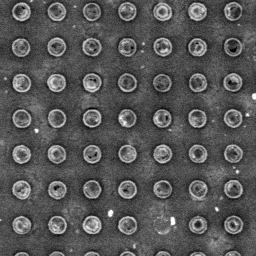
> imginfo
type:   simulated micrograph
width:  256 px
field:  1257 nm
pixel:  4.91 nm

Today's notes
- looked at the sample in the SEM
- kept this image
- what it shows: a regular array of raised bodies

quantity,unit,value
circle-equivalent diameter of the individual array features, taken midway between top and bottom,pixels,16.9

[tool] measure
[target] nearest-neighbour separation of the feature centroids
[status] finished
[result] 172 nm